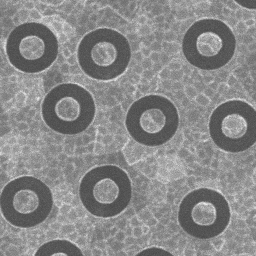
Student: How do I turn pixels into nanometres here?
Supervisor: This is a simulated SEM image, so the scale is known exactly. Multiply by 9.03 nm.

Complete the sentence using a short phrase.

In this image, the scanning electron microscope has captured ring-shaped grooves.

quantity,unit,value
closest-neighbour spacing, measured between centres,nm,742